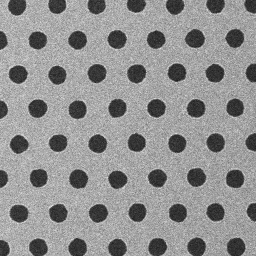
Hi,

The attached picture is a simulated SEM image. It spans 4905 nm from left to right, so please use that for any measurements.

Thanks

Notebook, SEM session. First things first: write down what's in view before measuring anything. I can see a regular array of holes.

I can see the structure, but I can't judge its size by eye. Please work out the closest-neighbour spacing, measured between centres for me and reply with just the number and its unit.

742 nm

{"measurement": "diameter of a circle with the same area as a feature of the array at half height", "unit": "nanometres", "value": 373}